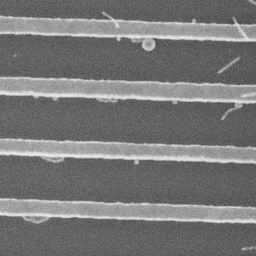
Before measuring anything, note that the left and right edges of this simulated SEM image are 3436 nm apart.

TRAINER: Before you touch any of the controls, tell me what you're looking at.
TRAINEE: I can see lines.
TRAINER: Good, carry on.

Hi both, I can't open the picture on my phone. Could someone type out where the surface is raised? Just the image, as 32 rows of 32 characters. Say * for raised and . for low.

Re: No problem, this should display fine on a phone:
................................
................................
************..*.................
********************************
............********************
................................
................................
................................
................................
................................
****************************....
********************************
......................**********
................................
................................
................................
................................
***.............................
******************************.*
.....***************************
................................
................................
................................
................................
................................
*******************.............
********************************
......................**********
................................
................................
................................
................................